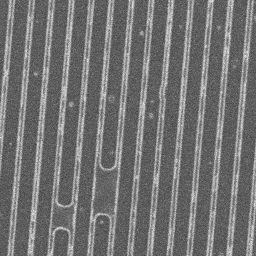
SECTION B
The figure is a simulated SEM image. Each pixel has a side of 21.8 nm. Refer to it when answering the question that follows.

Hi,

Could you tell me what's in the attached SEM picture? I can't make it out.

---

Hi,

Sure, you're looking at parallel lines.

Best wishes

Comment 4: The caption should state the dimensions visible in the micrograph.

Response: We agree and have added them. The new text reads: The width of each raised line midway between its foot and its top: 95 nanometers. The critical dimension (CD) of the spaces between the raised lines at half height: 0.35 microns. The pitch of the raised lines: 432 nm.